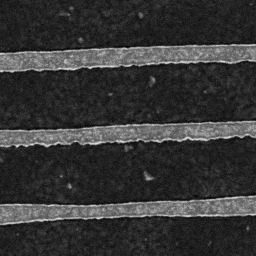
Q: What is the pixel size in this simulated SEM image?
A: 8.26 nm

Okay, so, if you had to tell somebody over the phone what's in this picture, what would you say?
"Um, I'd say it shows one or a few lines or trenches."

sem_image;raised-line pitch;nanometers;632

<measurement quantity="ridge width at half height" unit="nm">133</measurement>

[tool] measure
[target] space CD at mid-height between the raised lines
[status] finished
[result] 0.502 um